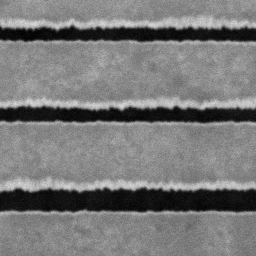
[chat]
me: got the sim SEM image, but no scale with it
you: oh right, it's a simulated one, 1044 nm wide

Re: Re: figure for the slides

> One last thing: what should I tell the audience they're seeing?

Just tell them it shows lines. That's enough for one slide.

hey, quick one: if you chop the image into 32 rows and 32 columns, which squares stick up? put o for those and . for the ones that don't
oooooooooooooooooooooooooooooooo
oooooooooooooooooooooooooooooooo
oooooooooooooooooooooooooooooooo
................................
................................
oooooooooooooooooooooooooooooooo
oooooooooooooooooooooooooooooooo
oooooooooooooooooooooooooooooooo
oooooooooooooooooooooooooooooooo
oooooooooooooooooooooooooooooooo
oooooooooooooooooooooooooooooooo
oooooooooooooooooooooooooooooooo
oooooooooooooooooooooooooooooooo
................................
................................
oooooooooooooooooooooooooooooooo
oooooooooooooooooooooooooooooooo
oooooooooooooooooooooooooooooooo
oooooooooooooooooooooooooooooooo
oooooooooooooooooooooooooooooooo
oooooooooooooooooooooooooooooooo
oooooooooooooooooooooooooooooooo
oooooooooooooooooooooooooooooooo
o........ooo....o....oooo.......
................................
................................
.o..o.....o..o......o.....o.....
oooooooooooooooooooooooooooooooo
oooooooooooooooooooooooooooooooo
oooooooooooooooooooooooooooooooo
oooooooooooooooooooooooooooooooo
oooooooooooooooooooooooooooooooo